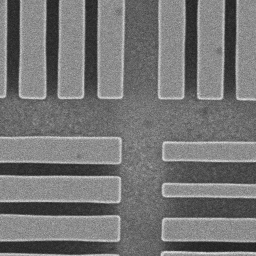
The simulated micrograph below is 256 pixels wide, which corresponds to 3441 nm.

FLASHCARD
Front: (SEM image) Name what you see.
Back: groups of lines, slits or small figures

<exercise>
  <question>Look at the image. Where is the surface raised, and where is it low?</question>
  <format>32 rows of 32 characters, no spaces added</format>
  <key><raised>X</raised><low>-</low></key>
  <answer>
X--XXX-XXX--XXXX----XXX--XXX--XX
X--XXX-XXX--XXXX----XXX--XXX--XX
X--XXX-XXX--XXXX----XXX--XXX--XX
X--XXX-XXX--XXXX----XXX--XXX--XX
X--XXX-XXX--XXX-----XXX--XXX--XX
X--XXX-XXX--XXX-----XXX--XXX--XX
X--XXX-XXX--XXX-----XXX--XXX--XX
X--XXX-XXX--XXX-----XXX--XXX--XX
X--XXX-XXX--XXX-----XXX--XXX--XX
X-XXXX-XXX--XXX-----XXX--XXX--XX
X-XXXX-XXX--XXX-----XXX--XXX--XX
X-XXXX-XXX--XXX-----XXX--XXX--XX
--------------------------------
--------------------------------
--------------------------------
--------------------------------
--------------------------------
XXXXXXXXXXXXXXX-----------------
XXXXXXXXXXXXXXX-----XXXXXXXXXXXX
XXXXXXXXXXXXXXX-----XXXXXXXXXXXX
--------------------------------
--------------------------------
XXXXXXXXXXXXXXX-----------------
XXXXXXXXXXXXXXX-----XXXXXXXXXXXX
XXXXXXXXXXXXXXX------XXXXXXXXXXX
--------------------------------
--------------------------------
XXXXXXXXXXXXXXX------XXXXXXXXXXX
XXXXXXXXXXXXXXX-----XXXXXXXXXXXX
XXXXXXXXXXXXXXX-----XXXXXXXXXXXX
--------------------------------
---------------------XXX--------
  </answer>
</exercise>